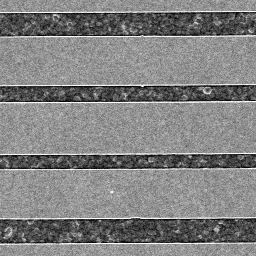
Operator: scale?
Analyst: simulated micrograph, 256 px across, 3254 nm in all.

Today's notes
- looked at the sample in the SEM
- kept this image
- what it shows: one or a few lines or trenches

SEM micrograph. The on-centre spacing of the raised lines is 0.845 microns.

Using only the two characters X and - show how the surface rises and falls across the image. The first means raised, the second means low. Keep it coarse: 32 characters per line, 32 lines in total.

XXXXXXXXXXXXXXXXXXXXXXXXXXXXXXXX
XXXXXXXXXX---XX-----X-XXXX--XX--
--------------------------------
--------------------------------
---------------X-X-----X--------
XXXXXXXXXXXXXXXXXXXXXXXXXXXXXXXX
XXXXXXXXXXXXXXXXXXXXXXXXXXXXXXXX
XXXXXXXXXXXXXXXXXXXXXXXXXXXXXXXX
XXXXXXXXXXXXXXXXXXXXXXXXXXXXXXXX
XXXXXXXXXXXXXXXXXXXXXXXXXXXXXXXX
XXXXXXXXXXXXXXXXXXXXXXXXXXXXXXXX
--------------------------------
-------X------------------------
XXXXXXXXXXXXXXXXXXXXXXXXXXXXXXXX
XXXXXXXXXXXXXXXXXXXXXXXXXXXXXXXX
XXXXXXXXXXXXXXXXXXXXXXXXXXXXXXXX
XXXXXXXXXXXXXXXXXXXXXXXXXXXXXXXX
XXXXXXXXXXXXXXXXXXXXXXXXXXXXXXXX
XXXXXXXXXXXXXXXXXXXXXXXXXXXXXXXX
-----X--------------------------
--------------------------------
XXXXXXXXXXXXXXXXXXXXXXXXXXXXXXXX
XXXXXXXXXXXXXXXXXXXXXXXXXXXXXXXX
XXXXXXXXXXXXXXXXXXXXXXXXXXXXXXXX
XXXXXXXXXXXXXXXXXXXXXXXXXXXXXXXX
XXXXXXXXXXXXXXXXXXXXXXXXXXXXXXXX
XXXXXXXXXXXXXXXXXXXXXXXXXXXXXXXX
---------------------X----------
--------------------------------
--------------------------------
-----------X------XXXXXXXXXXXXXX
XXXXXXXXXXXXXXXXXXXXXXXXXXXXXXXX